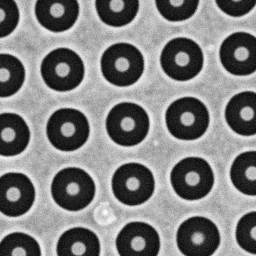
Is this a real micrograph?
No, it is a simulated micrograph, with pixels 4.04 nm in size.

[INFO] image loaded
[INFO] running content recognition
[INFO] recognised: an array of small figures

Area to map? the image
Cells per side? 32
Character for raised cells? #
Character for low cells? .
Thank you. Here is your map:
..##......##.....##......##.....
..##......##.....###....####...#
..###.....###....####..#########
..####...#######################
.###########################....
##############..#####....###....
######...####.....##.....##.....
...##.....###.....##......#.....
...##......##.....##.....###....
...##......##.....###....#####.#
...###....####...###############
..#####.######################..
######################...####...
########.#####....###.....##....
...###.....##......##.....##....
...###.....##......##.....##....
....##.....##......##.....###...
....##.....###....#####.########
...####...######################
..############################..
###############...####....###...
#.#####....###.....##......##...
....###.....##.....##......##...
....##......##.....###.....##...
....##......##.....###....#####.
....###....####...##############
...############################.
#######################...####..
#########..####....###.....##...
#...####....###.....##......#...
.....##......#......##......##..
.....##......##.....###....####.